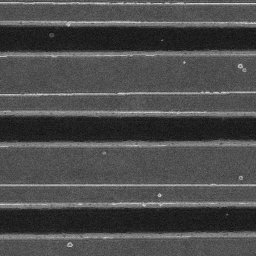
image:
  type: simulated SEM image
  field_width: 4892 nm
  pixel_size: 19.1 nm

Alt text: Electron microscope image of lines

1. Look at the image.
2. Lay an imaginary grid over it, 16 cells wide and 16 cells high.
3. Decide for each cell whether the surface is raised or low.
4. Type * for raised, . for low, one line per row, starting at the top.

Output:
****************
................
................
.....***********
****************
****************
****************
................
................
****************
****************
****************
****************
................
................
****************